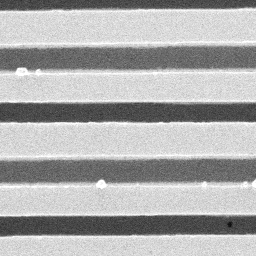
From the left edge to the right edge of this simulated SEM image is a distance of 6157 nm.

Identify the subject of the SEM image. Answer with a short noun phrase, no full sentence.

lines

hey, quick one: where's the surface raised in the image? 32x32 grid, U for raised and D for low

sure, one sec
DDDDDDDDDDDDDDDDDDDDDDDDDDDDDDDD
UUUUUUUUUUUUUUUUUUUUUUUUUUUUUUUU
UUUUUUUUUUUUUUUUUUUUUUUUUUUUUUUU
UUUUUUUUUUUUUUUUUUUUUUUUUUUUUUUU
UUUUUUUUUUUUUUUUUUUUUUUUUUUUUUUU
UUUUDUDDDDDDDDDDDDDDDDDDDDDDDDDD
DDDDDDDDDDDDDDDDDDDDDDDDDDDDDDDD
DDDDDDDDDDDDDDDDDDDDDDDDDDDDDDDD
DDDDDDDDDDDDDDDDDDDDDDDDDDDDDDDD
UUUUUUUUUUUUUUUUUUUUUUUUUUUUUUUU
UUUUUUUUUUUUUUUUUUUUUUUUUUUUUUUU
UUUUUUUUUUUUUUUUUUUUUUUUUUUUUUUU
UUUUUUUUUUUUUUUUUUUUUUUUUUUUUUUU
DDDDDDDDDDDDDDDDDDDDDDDDDDDDDDDD
DDDDDDDDDDDDDDDDDDDDDDDDDDDDDDDD
UUUUUUUUUUUUUUUUUUUUUUUUUUUUUUUU
UUUUUUUUUUUUUUUUUUUUUUUUUUUUUUUU
UUUUUUUUUUUUUUUUUUUUUUUUUUUUUUUU
UUUUUUUUUUUUUUUUUUUUUUUUUUUUUUUU
UUUUUUUUUUDDDDDDDDDDDDDDDDDDDDDD
DDDDDDDDDDDDDDDDDDDDDDDDDDDDDDDD
DDDDDDDDDDDDDDDDDDDDDDDDDDDDDDDD
DDDDDDDDDDDDDDDDDDDDDDDDDDDDDDDD
UUUUUUUUUUUUUUUUUUUUUUUUUUUUUUUU
UUUUUUUUUUUUUUUUUUUUUUUUUUUUUUUU
UUUUUUUUUUUUUUUUUUUUUUUUUUUUUUUU
UUUUUUUUUUUUUUUUUUUUUUUUUUUUUUUU
DDDDDDDDDDDDDDDDDDDDDDDDDDDDDDDD
DDDDDDDDDDDDDDDDDDDDDDDDDDDDDDDD
DDDDDDDDDDDDDDDDUUDUUUUUUUUUUUUU
UUUUUUUUUUUUUUUUUUUUUUUUUUUUUUUU
UUUUUUUUUUUUUUUUUUUUUUUUUUUUUUUU